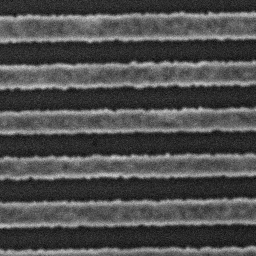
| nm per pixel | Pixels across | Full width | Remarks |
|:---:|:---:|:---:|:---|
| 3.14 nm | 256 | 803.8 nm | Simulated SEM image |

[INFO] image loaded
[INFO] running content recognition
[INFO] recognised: lines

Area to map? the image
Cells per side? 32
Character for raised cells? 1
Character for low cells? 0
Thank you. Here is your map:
00000000000000000000000000000000
00000000000000000000000000000000
11111111111111111111111111111111
11111111111111111111111111111111
11111111111111111111111111111111
00000000000000000000000000000000
00000000000000000000000000000000
00000000000000000000000000000000
11111111111111111111111111111111
11111111111111111111111111111111
11111111111111111111111111111111
00000000000000000000000000000000
00000000000000000000000000000000
00000000000000000000000000000010
11111111111111111111111111111111
11111111111111111111111111111111
11111111111111110000000000000000
00000000000000000000000000000000
00000000000000000000000000000000
00000000000000000000111111111111
11111111111111111111111111111111
11111111111111111111111111111111
00000000000000000000000000000000
00000000000000000000000000000000
00000000000000000000000000000000
11111111111111111111111111111111
11111111111111111111111111111111
11111111111111111111111111111111
00000000000000000000000000000000
00000000000000000000000000000000
00000000000000000000000000000000
11111111111111111111111111111111